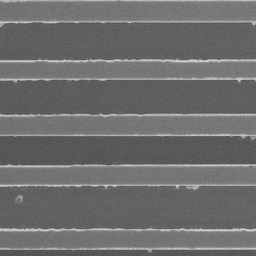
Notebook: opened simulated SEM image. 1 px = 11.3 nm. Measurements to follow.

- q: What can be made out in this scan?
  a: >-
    lines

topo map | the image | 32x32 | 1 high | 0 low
11111111111111111111111111111111
11111111111111111111111111111111
11111111111111111111111111111111
00000000000000000000000000000000
00000000000000000000000000000000
00000000000000000000000000000000
00000000000000000000000000000000
00000000000000000111000000000000
11111111111111111111111111111111
11111111111111111111111111111111
00000000000000000000000000000000
00000000000000000000000000000000
00000000000000000000000000000000
00000000000000000000000000000000
11111111111111111111111111111111
11111111111111111111111111111111
11111111111111111111111111111111
00000000000000000000000000000000
00000000000000000000000000000000
00000000000000000000000000000000
00000000000000000000000000000000
11111111111111111111111111111111
11111111111111111111111111111111
00000000000000000000000000000000
00000000000000000000000000000000
00000000000000000000000000000000
00000000000000000000000000000000
00000000000000000000000000000000
00000000000000000000000000000000
11111111111111111111111111111111
11111111111111111111111111111111
00000000000000000000000000000000